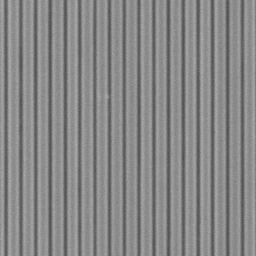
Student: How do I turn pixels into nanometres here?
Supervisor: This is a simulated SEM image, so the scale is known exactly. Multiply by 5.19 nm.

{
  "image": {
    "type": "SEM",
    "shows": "parallel lines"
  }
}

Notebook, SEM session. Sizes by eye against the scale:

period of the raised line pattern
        0.0767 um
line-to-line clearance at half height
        22.7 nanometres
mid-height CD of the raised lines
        55.2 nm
